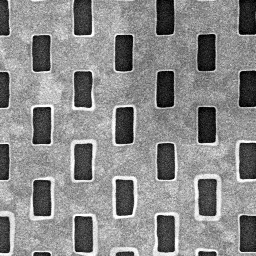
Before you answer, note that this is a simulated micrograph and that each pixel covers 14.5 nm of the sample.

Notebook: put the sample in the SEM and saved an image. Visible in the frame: groups of lines, slits or small figures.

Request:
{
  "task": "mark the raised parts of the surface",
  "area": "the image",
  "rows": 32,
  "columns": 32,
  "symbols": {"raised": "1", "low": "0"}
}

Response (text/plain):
01111111100011111110001111111100
01111111100011111110001111111100
01111111100011111110001111111100
01111111100011111110001111111100
01110011110111101111111110011111
11110011111111000111111110011111
11110011111111000111111110011111
11110011111111000111111110011111
11110011111111000111111110011111
01111111100011111111001111111100
01111111100011111110001111111100
01111111100011111110001111111100
01111111100011111110001111111100
01110011110111100111011110011101
11110001111111000111111110011111
11110001111111000111111110011111
11110001111111000111111110011111
11110001111111000111111110011111
01111111100011111111001111111100
01111111100011111111001111111100
01111111100011111111001111111100
01111111100011111111001111111100
01111011100111000111011110011100
11110001111111000111111110011111
11110001111111000111111110011111
11110001111111000111111110011111
11110001111111000111111110011111
00111111100011111110001111111100
00111111100011111110001111111100
00111111100011111110001111111100
00111111100011111111001111111100
01111011110011000111001110011100